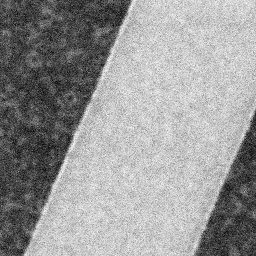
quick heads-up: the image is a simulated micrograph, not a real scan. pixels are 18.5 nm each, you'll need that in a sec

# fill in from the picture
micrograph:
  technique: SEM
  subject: one or a few lines or trenches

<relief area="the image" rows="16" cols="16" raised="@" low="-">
--------@@@@@@@@
--------@@@@@@@@
-------@@@@@@@@@
-------@@@@@@@@@
------@@@@@@@@@@
------@@@@@@@@@@
------@@@@@@@@@@
-----@@@@@@@@@@@
-----@@@@@@@@@@-
----@@@@@@@@@@@-
----@@@@@@@@@@--
---@@@@@@@@@@@--
---@@@@@@@@@@@--
--@@@@@@@@@@@---
--@@@@@@@@@@@---
--@@@@@@@@@@----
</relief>